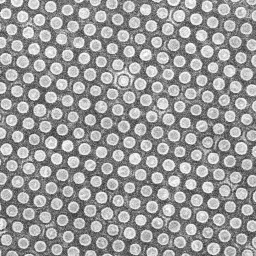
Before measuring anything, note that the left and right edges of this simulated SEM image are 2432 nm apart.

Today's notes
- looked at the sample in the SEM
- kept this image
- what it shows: a regular array of raised bodies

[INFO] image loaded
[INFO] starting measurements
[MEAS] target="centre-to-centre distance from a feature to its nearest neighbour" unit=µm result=0.16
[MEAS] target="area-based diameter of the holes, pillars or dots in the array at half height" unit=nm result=102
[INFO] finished